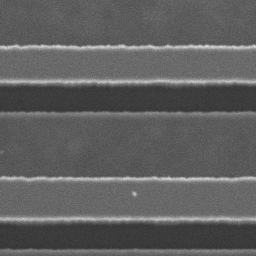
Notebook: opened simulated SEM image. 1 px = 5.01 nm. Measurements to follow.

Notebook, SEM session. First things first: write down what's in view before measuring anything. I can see lines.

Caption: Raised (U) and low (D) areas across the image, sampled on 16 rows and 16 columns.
UUUUUUUUUUUUUUUU
UUUUUUUUUUUUUUUU
UUUUUUUUUUUUUUUU
UUUUUUUUUUUUUUUU
UUUUUUUUUUUUUUUU
DDDDDDDDDDDDDDDD
DDDDDDDDDDDDDDDD
UUUUUUUUUUUUUUUU
UUUUUUUUUUUUUUUU
UUUUUUUUUUUUUUUU
UUUUUUUUUUUUUUUU
UUUUUUUUUUUUUUUU
UUUUUUUUUUUUUUUU
UUUUUUUUUUUUUUUU
DDDDDDDDDDDDDDDD
DDDDDDDDDDDDDDDD